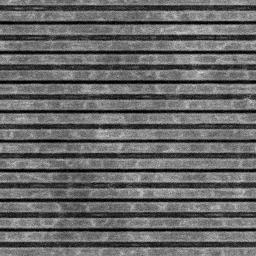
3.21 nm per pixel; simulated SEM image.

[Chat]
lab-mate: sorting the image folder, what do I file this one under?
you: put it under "parallel lines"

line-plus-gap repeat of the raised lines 0.0472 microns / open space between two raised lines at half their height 18.9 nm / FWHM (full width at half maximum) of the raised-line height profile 0.0297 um